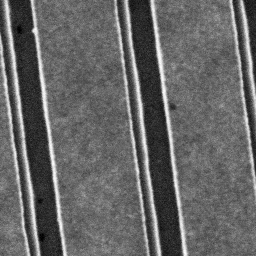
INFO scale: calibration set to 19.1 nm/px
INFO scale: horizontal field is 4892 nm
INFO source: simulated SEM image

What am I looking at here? lines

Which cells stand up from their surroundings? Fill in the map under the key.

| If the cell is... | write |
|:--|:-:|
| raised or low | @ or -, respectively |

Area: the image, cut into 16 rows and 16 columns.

--@@@@@---@@@@@-
--@@@@@---@@@@@-
--@@@@@@--@@@@@-
--@@@@@@--@@@@@-
---@@@@@--@@@@@-
---@@@@@--@@@@@-
@--@@@@@--@@@@@-
@--@@@@@--@@@@@-
@--@@@@@---@@@@@
@--@@@@@---@@@@@
@--@@@@@@--@@@@@
@--@@@@@@--@@@@@
@---@@@@@--@@@@@
@---@@@@@--@@@@@
@@--@@@@@--@@@@@
@@--@@@@@---@@@@